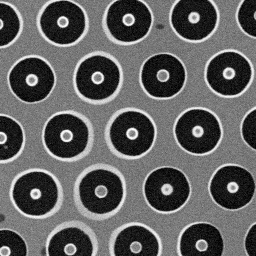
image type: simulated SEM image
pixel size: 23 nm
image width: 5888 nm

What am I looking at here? an array of small figures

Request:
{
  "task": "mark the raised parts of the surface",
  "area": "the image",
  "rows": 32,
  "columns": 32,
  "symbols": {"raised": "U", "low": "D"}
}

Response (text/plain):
DUUUUUDDDUUUUUDDDDUUUUDDDDDUUUDD
DDUUUDDDDDUUUDDDDDDUUDDDDDDUUUDD
DDDUUDDDDDDUUDDDUDDUUDDDDDDUUUDD
DDDUUDDDDDDUUDDDDDDUUUDDDDDUUUDD
DDUUUUDDDDUUUUDDDDUUUUDDDDUUUUUD
DUUUUUUDDUUUUUUUUUUUUUUUUUUUUUUU
UUUUUUUUUUUUUUUUUUUUUUUUUUUUDDUU
UUUDDUUUUUDDDDUUUUDDDDUUUUDDDDDU
UUDDDDUUUUDDDDDUUUDDDDDUUUDDDDDU
UDDDDDDUUDDDUDDUUUDDUDDUUUDDUDDD
UDDDDDDUUDDDDDDUUUDDDDDUUUDDDDDU
UUDDDDUUUUDDDDDUUUDDDDUUUUUDDDUU
UUUDDUUUUUUDDUUUUUUUUUUUUUUUUUUU
UUUUUUUUUUUUUUUUUUUUUUUUUUUUUUUU
DUUUUUUDDDUUUUDDDDUUUUUDDDDUUUUD
DDUUUUDDDDDUUUDDDDDUUUDDDDDUUUDD
DDDUUDDDUDDUUDDDUDDUUUDDUDDDUUDD
UDDUUDDDUDDUUUDDDDDUUUDDDDDUUUUD
DDDUUUDDDDDUUUDDDDDUUUUDDDDUUUUU
DDUUUUUDDDUUUUUDDUUUUUUUUUUUUUUU
UUUUUUUUUUUUUUUUUUUUUUUUUUUUUUUU
UUUUDDUUUUUDDDUUUUUDDDDUUUUDDDDU
UUDDDDDUUUDDDDDUUUDDDDDUUUDDDDDD
UUDDDDDUUUDDUDDDUUDDDDDDUUDDDDDD
UDDDUDDUUUDDUDDUUUDDDDDDUUDDDDDD
UUDDDDDUUUDDDDDUUUUDDDDUUUUDDDDU
UUUDDDUUUUUDDDUUUUUUDUUUUUUUUUUU
UUUUUUUUUUUUUUUUUUUUUUUUUUUUUUUU
UUUUUUUUDDUUUUUDDDUUUUUDDDDUUUUD
DDDUUUDDDDDUUUDDDDDDUUUDDDDDUUUD
DDDUUUDDDDDDUUDDDDDDUUDDDUDDUUUD
UDDUUUDDUDDDUUDDDDDDUUDDDDDDUUUD